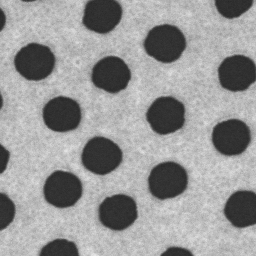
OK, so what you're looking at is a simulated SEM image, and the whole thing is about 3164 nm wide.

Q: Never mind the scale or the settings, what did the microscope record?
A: a regular array of holes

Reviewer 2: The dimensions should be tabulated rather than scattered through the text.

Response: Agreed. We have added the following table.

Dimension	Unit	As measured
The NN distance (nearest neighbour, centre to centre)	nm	728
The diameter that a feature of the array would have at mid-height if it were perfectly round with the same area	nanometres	477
